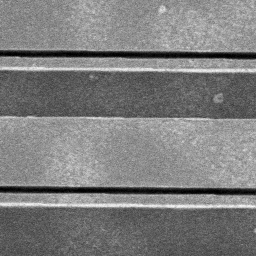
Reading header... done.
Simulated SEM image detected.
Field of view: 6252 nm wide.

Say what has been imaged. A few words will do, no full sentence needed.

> lines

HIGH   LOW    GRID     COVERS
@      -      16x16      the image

@@@@@@@@@@@@@@@@
@@@@@@@@@@@@@@@@
@@@@@@@@@@@@@@@@
@@@@@@@@@@@@@@@@
----------------
----------------
----------------
@@@@@@@@@@@@@@@@
@@@@@@@@@@@@@@@@
@@@@@@@@@@@@@@@@
@@@@@@@@@@@@@@@@
@@@@@@@@@@@@@@@@
@@@@@@@@@@@@@@@@
----------------
----------------
----------------